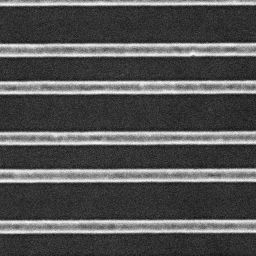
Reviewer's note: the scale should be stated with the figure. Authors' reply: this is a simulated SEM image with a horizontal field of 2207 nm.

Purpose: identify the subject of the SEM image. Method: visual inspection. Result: parallel lines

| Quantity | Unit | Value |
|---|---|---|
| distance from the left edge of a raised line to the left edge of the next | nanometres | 381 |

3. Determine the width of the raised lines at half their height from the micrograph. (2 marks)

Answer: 0.101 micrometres